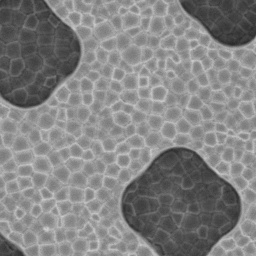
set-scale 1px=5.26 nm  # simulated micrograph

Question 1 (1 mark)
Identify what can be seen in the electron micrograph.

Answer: holes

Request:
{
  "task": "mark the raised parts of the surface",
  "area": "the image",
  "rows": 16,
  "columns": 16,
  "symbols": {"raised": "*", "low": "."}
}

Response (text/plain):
...********.....
....********....
.....********...
.....***********
.....***********
....************
*..*************
****************
****************
**********..****
*********....***
********......**
********.......*
********.......*
********......**
.********....***